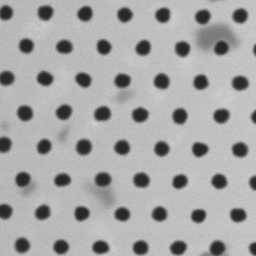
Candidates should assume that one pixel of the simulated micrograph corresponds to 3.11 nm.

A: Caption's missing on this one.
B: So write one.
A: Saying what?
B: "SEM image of a regular array of holes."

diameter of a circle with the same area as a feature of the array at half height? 44.5 nm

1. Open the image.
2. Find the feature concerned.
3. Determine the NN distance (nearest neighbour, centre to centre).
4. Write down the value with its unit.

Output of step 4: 117 nm